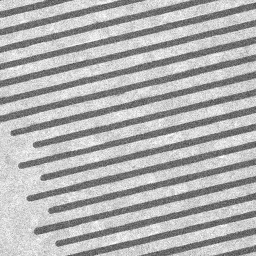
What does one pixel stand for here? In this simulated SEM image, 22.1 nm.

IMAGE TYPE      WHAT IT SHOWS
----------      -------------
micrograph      parallel lines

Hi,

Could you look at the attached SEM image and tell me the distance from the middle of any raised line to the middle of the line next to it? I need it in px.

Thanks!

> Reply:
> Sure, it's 16.9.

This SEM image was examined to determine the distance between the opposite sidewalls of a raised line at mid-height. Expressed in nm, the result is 213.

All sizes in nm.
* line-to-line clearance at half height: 162